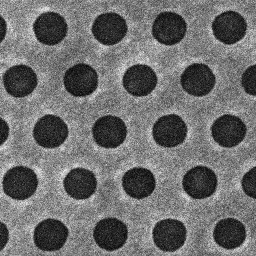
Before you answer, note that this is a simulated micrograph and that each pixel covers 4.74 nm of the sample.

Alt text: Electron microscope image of a regular array of holes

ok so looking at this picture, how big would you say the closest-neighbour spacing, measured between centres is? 0.279 micrometres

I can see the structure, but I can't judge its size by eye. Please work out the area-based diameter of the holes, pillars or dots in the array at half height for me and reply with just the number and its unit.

168 nm